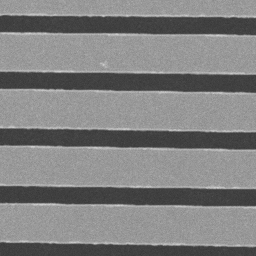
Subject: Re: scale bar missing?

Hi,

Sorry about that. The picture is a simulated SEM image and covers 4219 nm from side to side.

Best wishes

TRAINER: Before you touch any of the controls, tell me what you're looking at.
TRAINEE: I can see lines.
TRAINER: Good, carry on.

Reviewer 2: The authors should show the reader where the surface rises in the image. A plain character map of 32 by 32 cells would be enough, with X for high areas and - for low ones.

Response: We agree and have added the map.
XXXXXXXXXXXXXXXXXXXXXXXXXXXXXXXX
XXXXXXXXXXXXXXXXXXXXXXXXXXXXXXXX
--------------------------------
--------------------------------
XXXXXXXXXXXXXXXXXXXXXXXXXXXXXXXX
XXXXXXXXXXXXXXXXXXXXXXXXXXXXXXXX
XXXXXXXXXXXXXXXXXXXXXXXXXXXXXXXX
XXXXXXXXXXXXXXXXXXXXXXXXXXXXXXXX
XXXXXXXXXXXXXXXXXXXXXXXXXXXXXXXX
--------------------------------
--------------------------------
XXXXXXXXXXXXXXXXXXXXXXX---------
XXXXXXXXXXXXXXXXXXXXXXXXXXXXXXXX
XXXXXXXXXXXXXXXXXXXXXXXXXXXXXXXX
XXXXXXXXXXXXXXXXXXXXXXXXXXXXXXXX
XXXXXXXXXXXXXXXXXXXXXXXXXXXXXXXX
--------------------------------
--------------------------------
XXXXXXXXXXXXXXX-----------------
XXXXXXXXXXXXXXXXXXXXXXXXXXXXXXXX
XXXXXXXXXXXXXXXXXXXXXXXXXXXXXXXX
XXXXXXXXXXXXXXXXXXXXXXXXXXXXXXXX
XXXXXXXXXXXXXXXXXXXXXXXXXXXXXXXX
------------------------XXXXXXXX
--------------------------------
XXXXXXXX------------------------
XXXXXXXXXXXXXXXXXXXXXXXXXXXXXXXX
XXXXXXXXXXXXXXXXXXXXXXXXXXXXXXXX
XXXXXXXXXXXXXXXXXXXXXXXXXXXXXXXX
XXXXXXXXXXXXXXXXXXXXXXXXXXXXXXXX
-----------XXXXXXXXXXXXXXXXXXXXX
--------------------------------